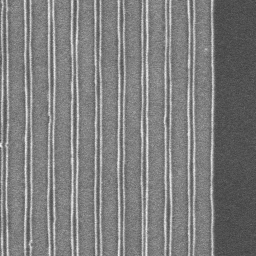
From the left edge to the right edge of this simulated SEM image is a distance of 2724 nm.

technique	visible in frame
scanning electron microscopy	parallel lines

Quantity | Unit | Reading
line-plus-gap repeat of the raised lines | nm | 248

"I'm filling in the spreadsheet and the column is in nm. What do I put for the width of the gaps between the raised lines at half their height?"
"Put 188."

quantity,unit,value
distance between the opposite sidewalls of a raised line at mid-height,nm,62.5